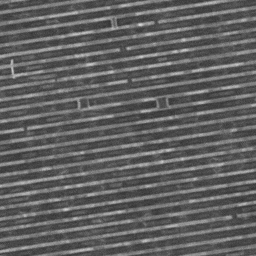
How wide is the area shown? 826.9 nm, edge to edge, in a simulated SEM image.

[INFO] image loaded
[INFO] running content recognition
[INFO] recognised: parallel lines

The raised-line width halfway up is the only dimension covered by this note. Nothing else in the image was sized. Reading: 0.008 um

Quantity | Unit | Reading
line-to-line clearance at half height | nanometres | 27.2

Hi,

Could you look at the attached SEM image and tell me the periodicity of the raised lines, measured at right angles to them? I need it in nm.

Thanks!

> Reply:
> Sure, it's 34.6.